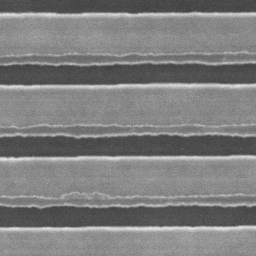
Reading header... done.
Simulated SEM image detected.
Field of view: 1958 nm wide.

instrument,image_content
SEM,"lines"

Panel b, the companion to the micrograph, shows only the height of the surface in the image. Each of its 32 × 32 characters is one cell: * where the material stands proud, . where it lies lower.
................................
................................
********************************
********************************
********************************
********************************
********************************
********************************
................................
................................
................................
********************************
********************************
********************************
********************************
********************************
********************************
................................
................................
.............................**.
********************************
********************************
********************************
********************************
********************************
********************************
................................
................................
.***.**.************************
********************************
********************************
********************************